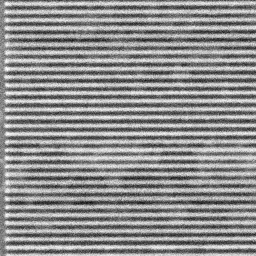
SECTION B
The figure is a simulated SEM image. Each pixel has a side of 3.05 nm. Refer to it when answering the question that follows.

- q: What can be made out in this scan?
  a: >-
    parallel lines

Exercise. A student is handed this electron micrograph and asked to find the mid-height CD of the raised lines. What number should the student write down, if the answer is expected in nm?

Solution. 8.4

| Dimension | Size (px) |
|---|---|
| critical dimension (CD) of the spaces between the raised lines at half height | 5.38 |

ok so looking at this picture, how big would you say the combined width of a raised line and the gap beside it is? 24.8 nm